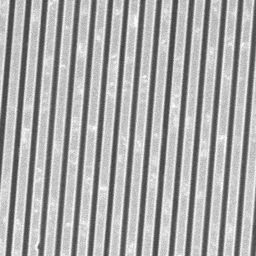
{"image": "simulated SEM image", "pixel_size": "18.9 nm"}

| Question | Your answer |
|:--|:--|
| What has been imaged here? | parallel lines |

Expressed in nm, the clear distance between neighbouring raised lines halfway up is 113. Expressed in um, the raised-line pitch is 0.308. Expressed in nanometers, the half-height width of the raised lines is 194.